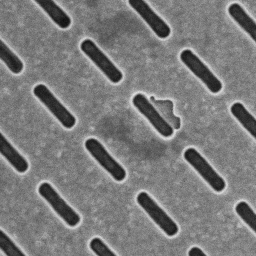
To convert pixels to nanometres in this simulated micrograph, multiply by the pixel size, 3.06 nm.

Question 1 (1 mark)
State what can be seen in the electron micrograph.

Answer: a regular array of holes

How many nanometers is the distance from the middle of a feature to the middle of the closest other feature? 198